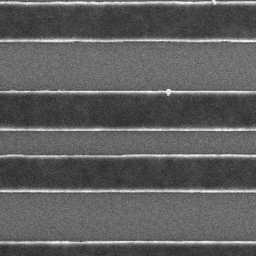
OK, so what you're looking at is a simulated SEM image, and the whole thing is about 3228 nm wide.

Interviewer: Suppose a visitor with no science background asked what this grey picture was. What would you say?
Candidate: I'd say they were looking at lines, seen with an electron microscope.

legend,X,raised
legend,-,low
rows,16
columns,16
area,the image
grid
XXXXXXXXXXXXXXXX
XXXXXXXXXXXXXXXX
XXXXXXXXXXXXXXXX
----------------
----------------
----------------
XXXXXXXXXXXXXXXX
XXXXXXXXXXXXXXXX
----------------
----------------
XXXXXXXXXXXXXXXX
XXXXXXXXXXXXXXXX
----------------
----------------
----------------
XXXXXXXXXXXXXXXX